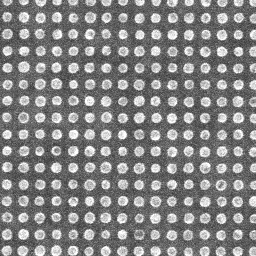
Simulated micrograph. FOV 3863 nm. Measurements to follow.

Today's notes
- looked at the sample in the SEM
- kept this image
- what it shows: a regular array of raised bodies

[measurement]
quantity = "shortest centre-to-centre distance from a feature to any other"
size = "244 nanometers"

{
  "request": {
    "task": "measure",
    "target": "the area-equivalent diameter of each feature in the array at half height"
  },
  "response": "135 nm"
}